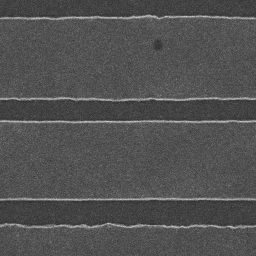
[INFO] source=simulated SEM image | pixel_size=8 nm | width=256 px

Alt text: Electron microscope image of one or a few lines or trenches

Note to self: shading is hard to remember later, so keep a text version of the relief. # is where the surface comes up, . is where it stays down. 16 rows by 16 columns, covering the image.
................
################
################
################
################
################
................
................
################
################
################
################
................
................
################
################